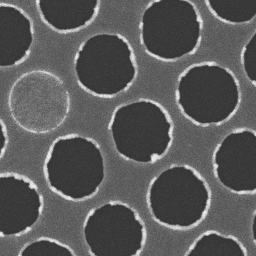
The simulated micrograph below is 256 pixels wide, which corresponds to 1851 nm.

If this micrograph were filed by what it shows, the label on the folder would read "holes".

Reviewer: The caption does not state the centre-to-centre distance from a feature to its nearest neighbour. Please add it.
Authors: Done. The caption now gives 0.545 um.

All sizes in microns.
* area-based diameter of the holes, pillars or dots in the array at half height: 0.426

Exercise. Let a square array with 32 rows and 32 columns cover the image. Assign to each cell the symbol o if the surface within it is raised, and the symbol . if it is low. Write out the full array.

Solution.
ooooo.......ooooooo.....oo......
..ooo.......oooooo......ooo.....
...ooo.....ooooooo.......ooo...o
....ooo..ooooooooo.......ooooooo
....oooooooo...ooo.......ooooooo
....ooooooo.....oo.......oooooo.
...ooooooo......ooo.....ooooooo.
..oooooooo......oooooooooooooo..
ooooooooo........ooooooo....ooo.
oooooooooo.......oooooo......oo.
oooooooooo......oooooo.......ooo
oooooooooooo...ooooooo........oo
oooooooooooooooooooooo........oo
ooooooooooooooo.....ooo......ooo
oooooooooooooo.......ooo.....ooo
oooooooooooooo.......ooooooooooo
oooooooooooooo.......ooooooooo.o
.ooooooo...ooo.......ooooooo....
ooooooo.....ooo......oooooo.....
oooooo.......ooo...oooooooo.....
oooooo.......oooooooooooooo.....
oooooo.......ooooooo....ooo.....
...ooo.......oooooo......ooo....
....ooo.....ooooooo.......ooo...
.....ooo...oooooooo.......oooooo
.....oooooooooooooo.......oooooo
.....ooooooo.....oo......ooooooo
.....oooooo......ooo.....ooooooo
...oooooooo.......oooooooooooooo
ooooooooooo.......oooooooo.ooooo
oooo...oooo.......ooooooo.....oo
ooo......ooo.....ooooooo......oo